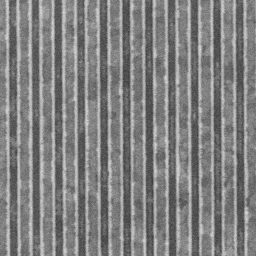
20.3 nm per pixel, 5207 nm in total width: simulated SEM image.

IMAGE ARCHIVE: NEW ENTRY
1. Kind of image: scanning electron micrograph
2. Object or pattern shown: parallel lines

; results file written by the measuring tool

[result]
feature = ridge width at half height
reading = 257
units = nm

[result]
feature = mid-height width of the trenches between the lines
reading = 203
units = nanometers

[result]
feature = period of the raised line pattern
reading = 462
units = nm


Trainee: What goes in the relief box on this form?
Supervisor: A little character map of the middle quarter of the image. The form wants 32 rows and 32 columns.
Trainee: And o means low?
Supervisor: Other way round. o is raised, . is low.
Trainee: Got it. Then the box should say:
ooo...ooo..ooo...ooo...ooo..ooo.
ooo...oo...ooo...ooo...ooo..ooo.
ooo...ooo..ooo...ooo...oo...ooo.
ooo...ooo..ooo...ooo...oo...ooo.
ooo...ooo..ooo...ooo...ooo..ooo.
ooo...ooo..ooo...ooo...ooo..ooo.
ooo...ooo..ooo...ooo...ooo..ooo.
ooo...ooo..ooo...ooo...oo...ooo.
ooo...ooo..ooo...ooo...ooo..ooo.
ooo...ooo..ooo...ooo...ooo..ooo.
ooo...ooo..ooo...ooo...ooo..ooo.
ooo...ooo..ooo...ooo...ooo..ooo.
ooo...ooo..ooo...ooo...ooo..ooo.
ooo...ooo..ooo...ooo...ooo..ooo.
ooo...ooo..ooo...ooo...ooo..ooo.
ooo...ooo..ooo...ooo...ooo..ooo.
ooo...ooo..ooo...ooo...ooo...oo.
ooo...ooo..ooo...ooo...ooo..ooo.
ooo...ooo..ooo...ooo...ooo...oo.
ooo...ooo..ooo...ooo...ooo...oo.
ooo...ooo...oo...ooo...ooo...oo.
ooo...ooo...oo...ooo...ooo..ooo.
ooo...ooo...oo...ooo...ooo..ooo.
ooo...ooo...oo...ooo...ooo...oo.
ooo...ooo..ooo...ooo...ooo...oo.
ooo...ooo..ooo...ooo...ooo...oo.
ooo...ooo..ooo...ooo...ooo...oo.
ooo...ooo...oo...ooo...ooo...oo.
ooo...ooo...oo...ooo...ooo..ooo.
ooo...ooo..ooo...ooo...ooo...ooo
ooo...ooo...oo...ooo...ooo..oooo
ooo...ooo...oo...ooo...ooo..oooo